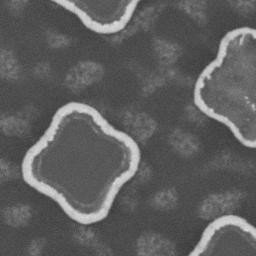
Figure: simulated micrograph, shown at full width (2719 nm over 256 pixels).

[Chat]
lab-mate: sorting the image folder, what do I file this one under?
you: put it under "raised bodies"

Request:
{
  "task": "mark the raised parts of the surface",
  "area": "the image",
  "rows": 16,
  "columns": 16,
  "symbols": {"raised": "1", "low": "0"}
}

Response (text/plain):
0000011100000000
0000001100000000
0000000000000011
0000000000000011
0000000000000111
0000000000001111
0000000000000111
0000110000000011
0001111100000001
0011111100000000
0011111100000000
0011111000000000
0000111000000000
0000010000000000
0000000000000111
0000000000001111